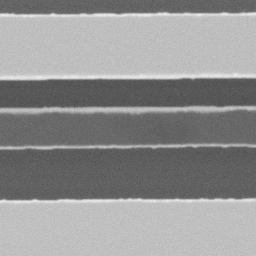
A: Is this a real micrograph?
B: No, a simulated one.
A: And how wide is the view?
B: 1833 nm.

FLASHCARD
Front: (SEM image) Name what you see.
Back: lines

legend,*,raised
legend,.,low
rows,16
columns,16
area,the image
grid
................
****************
****************
****************
****************
................
................
****************
****************
................
................
................
.......**..*****
****************
****************
****************